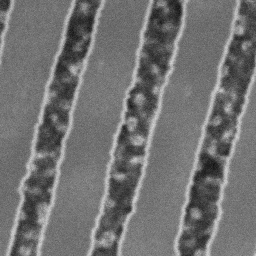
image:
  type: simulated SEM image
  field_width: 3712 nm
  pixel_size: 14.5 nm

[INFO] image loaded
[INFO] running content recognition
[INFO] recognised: one or a few lines or trenches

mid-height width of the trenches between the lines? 450 nanometres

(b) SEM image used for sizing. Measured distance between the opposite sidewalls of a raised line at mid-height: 727 nanometres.